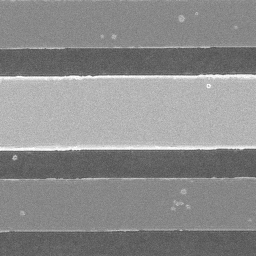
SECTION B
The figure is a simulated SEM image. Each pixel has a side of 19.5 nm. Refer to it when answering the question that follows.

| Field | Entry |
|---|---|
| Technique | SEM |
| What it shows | lines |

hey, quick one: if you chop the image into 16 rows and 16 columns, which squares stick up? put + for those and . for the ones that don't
++++++++++++++++
++++++++++++++++
++++++++++++++++
................
................
++++++++++++++++
++++++++++++++++
++++++++++++++++
++++++++++++++++
................
................
++++++++++++++++
++++++++++++++++
++++++++++++++++
................
................